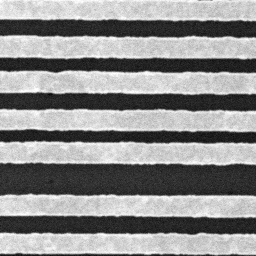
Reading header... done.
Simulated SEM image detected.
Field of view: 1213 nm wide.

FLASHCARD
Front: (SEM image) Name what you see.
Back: lines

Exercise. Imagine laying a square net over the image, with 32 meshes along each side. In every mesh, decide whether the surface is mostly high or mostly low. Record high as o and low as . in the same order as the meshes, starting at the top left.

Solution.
oooooooooooooooooooooooooooooooo
oooooooooooooooooooooooooooooooo
......................o....oo.oo
................................
................................
oooooooooooooooooooooooooooooooo
oooooooooooooooooooooooooooooooo
................................
................................
oooooooooooooooooooooooooooooooo
oooooooooooooooooooooooooooooooo
ooo..ooooooooooooooooooooooooooo
................................
................................
oooooooooooooooooooooooooooooooo
oooooooooooooooooooooooooooooooo
................................
................................
oooooooooooooooooooooooooooooooo
oooooooooooooooooooooooooooooooo
...........................o....
................................
................................
................................
ooooooooo...ooo.........o.......
oooooooooooooooooooooooooooooooo
oooooooooooooooooooooooooooooooo
................................
................................
oooooooooooooooooooooooooooooooo
oooooooooooooooooooooooooooooooo
oooooooooooooooooooooooooooooooo